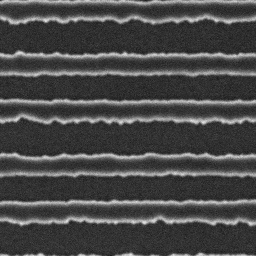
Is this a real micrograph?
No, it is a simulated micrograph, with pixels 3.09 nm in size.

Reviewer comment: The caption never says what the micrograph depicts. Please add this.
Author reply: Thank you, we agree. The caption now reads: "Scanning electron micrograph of lines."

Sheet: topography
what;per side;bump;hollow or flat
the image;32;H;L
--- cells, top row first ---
HHHHHHHHHHHHHHHHHHHHHHHHHHHHHHHH
HHHHHHHHHHHHHHHHHHHHHHHHHHHHHHHH
LHHHHHHHHHHHHLHHLHHHHHHHHLHHHHHH
LLLLLLLLLLLLLLLLLLLLLLLLLLLLLLLL
LLLLLLLLLLLLLLLLLLLLLLLLLLLLLLLL
LLLLLLLLLLLLLLLLLLLLLLLLLLLLLLLL
LLLLLLLLLLLLLLLLLLLLLLLLLLLLLLLL
HHHHHHHHHHHHHHHHHHHHHHHHHHHHHHHH
HHHHHHHHHHHHHHHHHHHHHHHHHHHHHHHH
LLLLLLLLLLLLLLLLLLLLLLLLLLLLLLLL
LLLLLLLLLLLLLLLLLLLLLLLLLLLLLLLL
LLLLLLLLLLLLLLLLLLLLLLLLLLLLLLLL
HHHLLLLLLLLLLLLLLLLLLLLLLLLLLLLL
HHHHHHHHHHHHHHHHHHHHHHHHHHHHHHHH
HHHHHHHHHHHHHHHHHHHHHHHHHHHHHHHH
LLLLLLLLLLLLLLLLLLLLLLLLLLLLLLLL
LLLLLLLLLLLLLLLLLLLLLLLLLLLLLLLL
LLLLLLLLLLLLLLLLLLLLLLLLLLLLLLLL
LLLLLLLLLLLLLLLLLLLLLLLLLLLLLLLL
HHHLLLLHHHHHHHHLLHHHHHHHHHHLHHHH
HHHHHHHHHHHHHHHHHHHHHHHHHHHHHHHH
HHHHHHHHHHHHHHHHHHHHHHHHHHHHHHHH
LLLLLLLLLLLLLLLLLLLLLLLLLLLLLLLL
LLLLLLLLLLLLLLLLLLLLLLLLLLLLLLLL
LLLLLLLLLLLLLLLLLLLLLLLLLLLLLLLL
HHHHHHHHHHHHHHHHHHHHHHHHHHHHHHHH
HHHHHHHHHHHHHHHHHHHHHHHHHHHHHHHH
HHHHHHHHHHHHHHHHHHHHHHHHHHHHHHHH
LLLLLLLLLLLLLLLLLLLLLLLLLLLLLLLL
LLLLLLLLLLLLLLLLLLLLLLLLLLLLLLLL
LLLLLLLLLLLLLLLLLLLLLLLLLLLLLLLL
LLLLLLLLLLLLLLLLLLLLLLLLLLLLLLLL